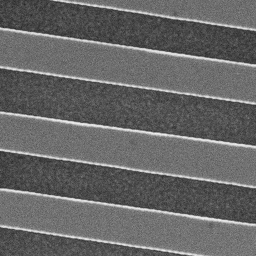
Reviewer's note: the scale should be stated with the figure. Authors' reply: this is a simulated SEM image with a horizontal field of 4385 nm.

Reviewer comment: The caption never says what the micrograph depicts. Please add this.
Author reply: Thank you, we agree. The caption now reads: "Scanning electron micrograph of lines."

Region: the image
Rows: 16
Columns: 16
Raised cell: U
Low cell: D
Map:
DDDDDDUUUUUUUUUU
DDDDDDDDDDDDDUUU
UUUUUDDDDDDDDDDD
UUUUUUUUUUUUDDDD
DDUUUUUUUUUUUUUU
DDDDDDDDDUUUUUUU
DDDDDDDDDDDDDDDD
UUUUDDDDDDDDDDDD
UUUUUUUUUUUDDDDD
DUUUUUUUUUUUUUUU
DDDDDDDUUUUUUUUU
DDDDDDDDDDDDDDUU
UUUUUDDDDDDDDDDD
UUUUUUUUUUUUDDDD
DDUUUUUUUUUUUUUU
DDDDDDDDDUUUUUUU